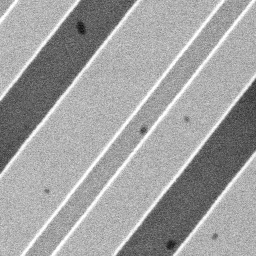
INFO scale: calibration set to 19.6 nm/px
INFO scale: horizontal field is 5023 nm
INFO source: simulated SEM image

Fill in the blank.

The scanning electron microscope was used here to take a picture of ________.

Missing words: lines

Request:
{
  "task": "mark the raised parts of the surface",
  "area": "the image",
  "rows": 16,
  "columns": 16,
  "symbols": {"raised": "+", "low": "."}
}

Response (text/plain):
+++++...++++++++
++++...+++++++++
+++....+++++++++
++....++++++++++
+....+++++++++++
+...+++++++++++.
...++++++++++++.
...+++++++++++..
..+++++++++++...
.+++++++++++....
++++++++++++...+
+++++++++++...++
++++++++++....++
+++++++++....+++
++++++++....++++
++++++++...+++++